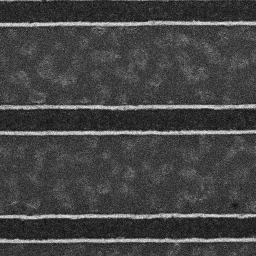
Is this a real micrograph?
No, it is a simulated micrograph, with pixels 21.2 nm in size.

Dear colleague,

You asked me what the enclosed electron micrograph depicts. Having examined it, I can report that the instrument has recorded one or a few lines or trenches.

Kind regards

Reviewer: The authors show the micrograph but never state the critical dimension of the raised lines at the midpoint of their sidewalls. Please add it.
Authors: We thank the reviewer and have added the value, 536 nm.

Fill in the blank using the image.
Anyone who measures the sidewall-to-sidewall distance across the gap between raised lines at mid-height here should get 1770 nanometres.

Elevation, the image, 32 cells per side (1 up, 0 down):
11111111111111111111111111111111
11111111111111111111111111111111
11111111111111111111111111111111
00000000000000000000000000000000
00000000000000000000000000000000
00000000000000000000000000000000
00000000000000000000000000000000
00000000000000000000000000000000
00000000000000000000000000000000
00000000000000000000000000000000
00000000000000000000000000000000
00000000000000000000000000000000
00000000000000000000000000000000
11111111111111111111111111111111
11111111111111111111111111111111
11111111111111111111111111111111
11111111111111111101111100000000
00000000000000000000000000000000
00000000000000000000000000000000
00000000000000000000000000000000
00000000000000000000000000000000
00000000000000000000000000000000
00000000000000000000000000000000
00000000000000000000000000000000
00000000000000000000000000000000
00000000000000000000000000000000
00000000000000000000000000000000
11111111111111111111111111111111
11111111111111111111111111111111
11111111111111111111111111111111
00000000000000000000000000000000
00000000000000000000000000000000